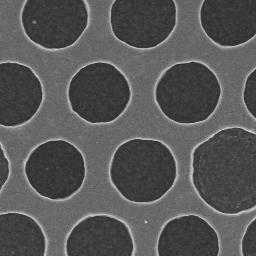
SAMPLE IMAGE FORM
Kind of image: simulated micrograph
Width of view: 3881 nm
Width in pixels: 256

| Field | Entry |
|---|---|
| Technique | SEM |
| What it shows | holes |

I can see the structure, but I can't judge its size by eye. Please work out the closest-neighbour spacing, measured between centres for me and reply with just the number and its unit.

1330 nanometres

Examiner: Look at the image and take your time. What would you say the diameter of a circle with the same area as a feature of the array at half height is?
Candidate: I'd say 935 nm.